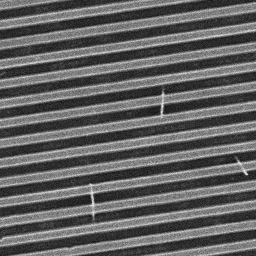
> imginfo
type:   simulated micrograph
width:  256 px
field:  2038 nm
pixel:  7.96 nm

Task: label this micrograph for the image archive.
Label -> parallel lines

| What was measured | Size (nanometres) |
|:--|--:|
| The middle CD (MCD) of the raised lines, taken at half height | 71.9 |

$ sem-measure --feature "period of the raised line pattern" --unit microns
0.156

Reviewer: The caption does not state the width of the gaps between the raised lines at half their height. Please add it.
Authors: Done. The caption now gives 79.8 nanometers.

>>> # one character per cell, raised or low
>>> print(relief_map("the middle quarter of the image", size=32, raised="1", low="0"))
00000001111111111111110000000000
11111111111111100000000000000000
11111111000000000000000000001111
11000000000000000000011111111111
00000000000000111111111111111000
00000010111111111111110000000000
11111111111111100000000000000000
11111111100000000000000010011111
11000000000000000000111111111111
00000000000001111111111111110000
00000011111111111111100000000000
11111111111111000000000000000000
11111110000000000000000010011111
10000000000000000000111111111111
00000000000001111111111111110000
00000001111111111111100000000000
11111111111111000000000000000000
11111111000000000000000000111111
10000000000000000001111111111111
00000000000011111111111111100000
00000111111111111111000000000000
11111111111111100000000000000000
11111100000000000000000000111111
00000000000000000001111111111111
00000000000001111111111111100000
00000011111111111111000000000000
11111111111111000000000000000000
11111110000000000000000001111111
00000000000000000011111111111111
00000000000111111111111111000000
00000111111111111110000000000000
11111111111100000000000000000000